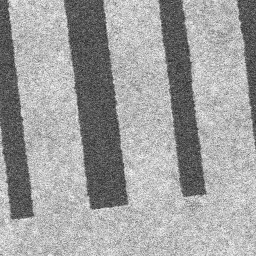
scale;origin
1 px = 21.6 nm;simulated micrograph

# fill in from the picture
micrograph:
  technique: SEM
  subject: one or a few lines or trenches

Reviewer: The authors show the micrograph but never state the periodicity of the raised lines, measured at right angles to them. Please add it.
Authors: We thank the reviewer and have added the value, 1.9 micrometres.